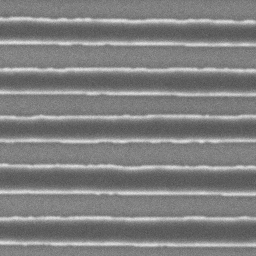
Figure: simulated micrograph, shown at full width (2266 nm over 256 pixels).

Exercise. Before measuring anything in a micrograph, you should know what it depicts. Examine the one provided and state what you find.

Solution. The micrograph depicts lines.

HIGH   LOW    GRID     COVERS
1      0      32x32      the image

00000000000000000000000000000000
00000000000000000000000000000000
11111111111111110011110111100000
11111111111111111111111111111111
11111111111111111111111111111111
00000001001110111111111111111111
00000000000000000000000000000000
00000000000000000000000000000000
00000000000000000000000000000000
11111111111111111111111111111111
11111111111111111111111111111111
11111111111111111111111111111111
00000000000000000000000000000000
00000000000000000000000000000000
00000000000000000011111110000011
11111111111111111111111111111111
11111111111111111111111111111111
11111111111111111111111111111111
00000000000000000000000000000000
00000000000000000000000000000000
00000000000000000000000000000000
11111111111111111111111111111111
11111111111111111111111111111111
11111111111111111111111111111111
00000000000000000000000000000000
00000000000000000000000000000000
00000000000000000000000000000000
11111111111111111111111111111111
11111111111111111111111111111111
11111111111111111111111111111111
00000001001111111111111111111111
00000000000000000000000000000000